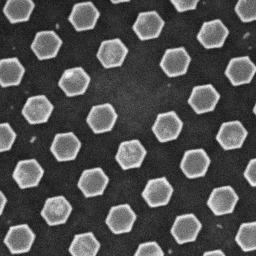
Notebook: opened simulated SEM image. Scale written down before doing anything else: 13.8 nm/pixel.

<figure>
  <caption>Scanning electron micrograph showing a regular array of raised bodies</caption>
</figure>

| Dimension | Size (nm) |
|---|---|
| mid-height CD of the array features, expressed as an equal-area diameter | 386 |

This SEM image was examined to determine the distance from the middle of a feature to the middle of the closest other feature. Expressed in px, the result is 45.9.